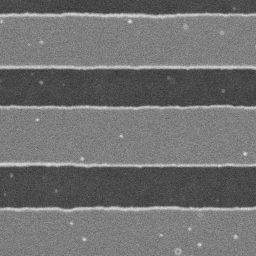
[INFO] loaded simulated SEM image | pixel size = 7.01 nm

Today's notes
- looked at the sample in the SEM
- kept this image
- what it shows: lines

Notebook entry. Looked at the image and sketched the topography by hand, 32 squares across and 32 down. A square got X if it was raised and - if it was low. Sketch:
--------------------------------
--------------------------------
XXXXXXXXXXXXXXXXXXXXXXXXXXXXXXXX
XXXXXXXXXXXXXXXXXXXXXXXXXXXXXXXX
XXXXXXXXXXXXXXXXXXXXXXXXXXXXXXXX
XXXXXXXXXXXXXXXXXXXXXXXXXXXXXXXX
XXXXXXXXXXXXXXXXXXXXXXXXXXXXXXXX
XXXXXXXXXXXXXXXXXXXXXXXXXXXXXXXX
-XX----XXXXXXXXXXXX--XXX---XX--X
--------------------------------
--------------------------------
--------------------------------
--------------------------------
XXXXXXXXXXXXXXXXXXXXXXXXXXXXXXXX
XXXXXXXXXXXXXXXXXXXXXXXXXXXXXXXX
XXXXXXXXXXXXXXXXXXXXXXXXXXXXXXXX
XXXXXXXXXXXXXXXXXXXXXXXXXXXXXXXX
XXXXXXXXXXXXXXXXXXXXXXXXXXXXXXXX
XXXXXXXXXXXXXXXXXXXXXXXXXXXXXXXX
XXXXXXXXXXXXXXXXXXXXXXXXXXXXXXXX
XXXXXXXXXXXXXXXXXXXXXXXXXXXXXXXX
--------------------------------
--------------------------------
--------------------------------
--------------------------------
--------------------------------
XXXXXXXXXXXXXXXXXXXXXXXXXXXXXXXX
XXXXXXXXXXXXXXXXXXXXXXXXXXXXXXXX
XXXXXXXXXXXXXXXXXXXXXXXXXXXXXXXX
XXXXXXXXXXXXXXXXXXXXXXXXXXXXXXXX
XXXXXXXXXXXXXXXXXXXXXXXXXXXXXXXX
XXXXXXXXXXXXXXXXXXXXXXXXXXXXXXXX